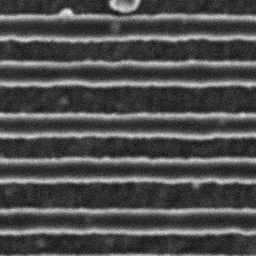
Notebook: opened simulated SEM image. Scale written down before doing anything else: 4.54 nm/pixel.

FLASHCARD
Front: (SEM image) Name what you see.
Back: lines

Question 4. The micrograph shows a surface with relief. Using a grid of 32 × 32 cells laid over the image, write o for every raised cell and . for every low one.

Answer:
..............ooo...............
........o......o................
oooooooooooooooooooooooooooooooo
oooooooooooooooooooooooooooooooo
oooooooooooooooooooooooooooooooo
................................
................................
................................
oooooooooooooooooooooooooooooooo
oooooooooooooooooooooooooooooooo
oooooooo..oooooooooooooooooooooo
................................
................................
................................
oooooooooooooooooooooooooooooooo
oooooooooooooooooooooooooooooooo
oooooooooooooooooooooooooooooooo
................................
................................
................................
oooooooooooooooooooooooooooooooo
oooooooooooooooooooooooooooooooo
oooooooooooooooooooooooooooooooo
................................
................................
................................
oooooooooooooooooooooooooooooooo
oooooooooooooooooooooooooooooooo
oooooooooooooooooooooooooooooooo
................................
................................
................................